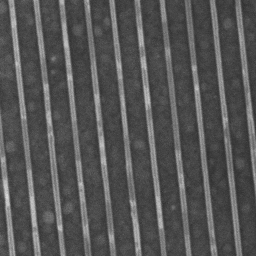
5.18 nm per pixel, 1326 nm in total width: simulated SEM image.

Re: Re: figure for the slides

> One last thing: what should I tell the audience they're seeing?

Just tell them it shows parallel lines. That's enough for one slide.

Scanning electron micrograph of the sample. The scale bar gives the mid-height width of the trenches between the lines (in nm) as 108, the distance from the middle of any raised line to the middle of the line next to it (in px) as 25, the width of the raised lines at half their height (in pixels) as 4.73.